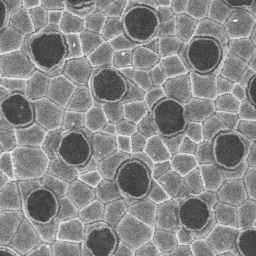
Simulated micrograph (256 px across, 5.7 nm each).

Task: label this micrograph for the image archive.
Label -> a regular array of raised bodies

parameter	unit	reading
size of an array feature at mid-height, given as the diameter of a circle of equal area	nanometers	192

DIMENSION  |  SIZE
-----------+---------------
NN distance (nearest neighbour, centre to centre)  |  294 nanometres